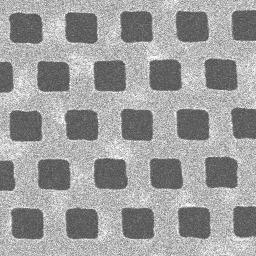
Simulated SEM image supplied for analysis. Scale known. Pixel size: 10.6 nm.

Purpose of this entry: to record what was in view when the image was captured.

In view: a regular array of holes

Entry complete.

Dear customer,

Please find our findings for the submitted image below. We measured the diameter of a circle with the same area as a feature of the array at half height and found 0.372 um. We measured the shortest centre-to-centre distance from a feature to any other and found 585 nm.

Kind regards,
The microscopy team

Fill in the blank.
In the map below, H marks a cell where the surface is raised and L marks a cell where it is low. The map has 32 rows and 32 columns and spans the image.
HHHHHHHHHHHHHHHHHHHHHHHHHHHHHHHH
HHHHHHHHHHHHHHHLLLLHHHLLLHHHHLLL
HLLLLHHHLLLLHHHLLLLHHHLLLLHHHLLL
HLLLLHHHLLLLHHHLLLLHHHLLLLHHHLLL
HLLLLHHHLLLLHHHLLLLHHHLLLLHHHLLL
HHHHHHHHHHHLHHHHHHHHHHHHHHHHHHHH
HHHHHHHHHHHHHHHHHHHHHHHHHHHHHHHH
HHHHHHHHHHHHHHHHHHHLLLHHHHLLLHHH
LLHHHLLLLHHHLLLLHHHLLLLHHHLLLLHH
LLHHHLLLLHHHLLLLHHHLLLLHHHLLLLHH
LLHHHLLLLHHHLLLLHHHLLLLHHHLLLLHH
LHHHHHLLHHHHHHHHHHHHHHHHHHHHHHHH
HHHHHHHHHHHHHHHHHHHHHHHHHHHHHHHH
HHHHHHHHHHHHHHHHHHHHHHHHHHHHHLLH
HLLLLHHHLLLLHHHLLLLHHHLLLLHHHLLL
HLLLLHHHLLLLHHHLLLLHHHLLLLHHHLLL
HLLLLHHHLLLLHHHLLLLHHHLLLLHHHLLL
HHLLLHHHHLLLHHHHLLLHHHHHLLHHHHHH
HHHHHHHHHHHHHHHHHHHHHHHHHHHHHHHH
HHHHHHHHHHHHHHHHHHHHHHHHHHHHHHHH
LLHHHLLLLHHHLLLLHHHLLLLHHHLLLLHH
LLHHHLLLLHHHLLLLHHHLLLLHHHLLLLHH
LLHHHLLLLHHHLLLLHHHLLLLHHHLLLLHH
LLHHHLLLLHHHLLLLHHHLLLLHHHHHHHHH
HHHHHHHHHHHHHHHHHHHHHHHHHHHHHHHH
HHHHHHHHHHHHHHHHHHHHHHHHHHHHHHHH
HLLLLHHHLLLLHHHLLLLHHHLLLLHHHLLL
HLLLLHHHLLLLHHHLLLLHHHLLLLHHHLLL
HLLLLHHHLLLLHHHLLLLHHHLLLLHHHLLL
HHLLLHHHLLLLHHHHLLLHHHHLLLHHHHLL
HHHHHHHHHHHHHHHHHHHHHHHHHHHHHHHH
HHHHHHHHHHHHHHHHHHHHHHHHHHHHHHHH